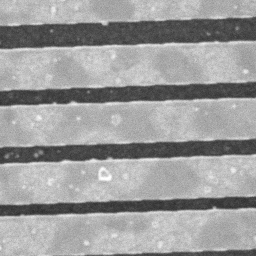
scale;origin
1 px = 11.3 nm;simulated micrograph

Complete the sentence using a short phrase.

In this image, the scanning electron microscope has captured lines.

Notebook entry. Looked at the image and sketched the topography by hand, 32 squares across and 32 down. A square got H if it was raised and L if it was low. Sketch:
HHHHHHHHHHHHHHHHHHHHHHHHHHHHHHHH
HHHHHHHHHHHHHHHHHHHHHHHHHHHHHHHH
HHHHHHHHHHHHHHHHHHLLLLLLLLLLLLLL
LLLLLLLLLLLLLLLLLLLLLLLLLLLLLLLL
LLLLLLLLLLLLLLLLLLLLLLLLLLLLLLLL
LLLLLLLLLLLLLLLLLLLLHHHHHHHHHHHH
HHHHHHHHHHHHHHHHHHHHHHHHHHHHHHHH
HHHHHHHHHHHHHHHHHHHHHHHHHHHHHHHH
HHHHHHHHHHHHHHHHHHHHHHHHHHHHHHHH
HHHHHHHHHHHHHHHHHHHHHHHHHHHHHHHH
HHHHHHHHHHHHHHHHHHHLLLLLLLLLLLLL
LLLLLLLLLLLLLLLLLLLLLLLLLLLLLLLL
LLLLLLLLLLLLLLLLLLLLLLLLHHHHHHHH
HHHHHHHHHHHHHHHHHHHHHHHHHHHHHHHH
HHHHHHHHHHHHHHHHHHHHHHHHHHHHHHHH
HHHHHHHHHHHHHHHHHHHHHHHHHHHHHHHH
HHHHHHHHHHHHHHHHHHHHHHHHHHHHHHHH
HHHHHHHHHHHHHHHHHHHHHHHLLLLLLLLL
LLLLLLLLLLLLLLLLLLLLLLLLLLLLLLLL
LLLLLLLLLLLLLLLLLLLLLLLLLLLLHHHH
HHHHHHHHHHHHHHHHHHHHHHHHHHHHHHHH
HHHHHHHHHHHHHHHHHHHHHHHHHHHHHHHH
HHHHHHHHHHHHHHHHHHHHHHHHHHHHHHHH
HHHHHHHHHHHHHHHHHHHHHHHHHHHHHHHH
HHHHHHHHHHHHHHHHHHHHHHHHHHHHLLLL
LLLLLLLLLLLLLLLLLLLLLLLLLLLLLLLL
LLLLLLLLLLLLLLLLLLLHHHHHHHHHHHHH
HHHHHHHHHHHHHHHHHHHHHHHHHHHHHHHH
HHHHHHHHHHHHHHHHHHHHHHHHHHHHHHHH
HHHHHHHHHHHHHHHHHHHHHHHHHHHHHHHH
HHHHHHHHHHHHHHHHHHHHHHHHHHHHHHHH
HHHHHHHHHHHHHHHHHHLLLLLLLLLLLLLL